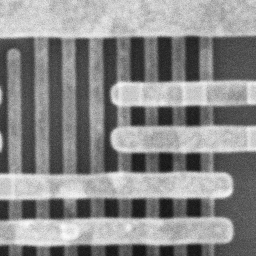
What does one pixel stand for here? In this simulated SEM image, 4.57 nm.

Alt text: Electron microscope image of wiring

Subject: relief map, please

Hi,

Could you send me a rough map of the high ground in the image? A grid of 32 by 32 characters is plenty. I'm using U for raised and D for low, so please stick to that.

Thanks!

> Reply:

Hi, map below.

UUUUUUUUUUUUUUUUUUUUUUUUUUUUUUUU
UUUUUUUUUUUUUUUUUUUUUUUUUUUUUUUU
UUUUUUUUUUUUUUUUUUUUUUUUUUUUUUUU
UUUUUUUUUUUUUUUUUUUUUUUUUUUUUUUU
UUUUUUUUUUUUUUUUUUUDDDDDDDUUDDDD
DDDDDDDDDDDDDDDDDDDDDDDDDDDDDDDD
DDDDDDDDDDDDDDDDDDDDDDDDDDDDDDDD
DDDDDDDDDDDDDDDDDDDDDDDDDDDDDDDD
DDDDDDDDDDDDDDDDDDDDDDDDDDDDDDDD
DDDDDDDDDDDDDDDDDDDDDDDDDDDDDDDD
DDDDDDDDDDDDDDDUUUUUUUUUUUUUUUUU
DDDDDDDDDDDDDDUUUUUUUUUUUUUUUUUU
DDDDDDDDDDDDDDUUUUUUUUUUUUUUUUUU
DDDDDDDDDDDDDDDDDDDDDDDDDDDDDDDD
DDDDDDDDDDDDDDDDDDDDDDDDDDDDDDDD
DDDDDDDDDDDDDDDDDDDDDDDDDDDDDDDD
DDDDDDDDDDDDDDUUUUUUUUUUUUUUUUUU
DDDDDDDDDDDDDDUUUUUUUUUUUUUUUUUU
DDDDDDDDDDDDDDUUUUUUUUUUUUUUUUUU
DDDDDDDDDDDDDDDDDDDDDDDDDDDDDDDD
DDDDDDDDDDDDDDDDDDDDDDDDDDDDDDDD
DDDDDDDDDDDDDDDDDDDDDDDDDDDDDDDD
UUUUUUUUUUUUUUUUUUUUUUUUUUUUUDDD
UUUUUUUUUUUUUUUUUUUUUUUUUUUUUDDD
UUUUUUUUUUUUUUUUUUUUUUUUUUUUDDDD
DDDDDDDDDDDDDDDDDDDDDDDDDDDDDDDD
DDDDDDDDDDDDDDDDDDDDDDDDDDDDDDDD
DDDDDDDDDUUUUUUUUUUUUUUUUUUUDDDD
UUUUUUUUUUUUUUUUUUUUUUUUUUUUUDDD
UUUUUUUUUUUUUUUUUUUUUUUUUUUUUDDD
UDUUUUUUUUUUUUDDDDUUUUDDDDDDDDDD
DDDDDDDDDDDDDDDDDDDDDDDDDDDDDDDD